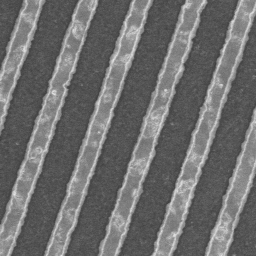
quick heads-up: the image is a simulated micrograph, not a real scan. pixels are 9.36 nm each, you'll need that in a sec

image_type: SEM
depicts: parallel lines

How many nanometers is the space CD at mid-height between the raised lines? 308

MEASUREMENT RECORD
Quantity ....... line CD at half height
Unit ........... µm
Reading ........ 0.162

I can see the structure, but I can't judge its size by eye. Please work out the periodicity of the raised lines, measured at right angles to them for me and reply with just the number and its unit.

50.8 pixels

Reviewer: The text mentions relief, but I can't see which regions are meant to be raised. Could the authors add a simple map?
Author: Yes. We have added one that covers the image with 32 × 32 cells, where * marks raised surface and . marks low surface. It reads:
...**.....**....***....***....**
...**....***....**.....**....***
..***....**.....**.....**....**.
..**.....**....***....**.....**.
..**....***....**.....**.....**.
.***....**.....**....***....**..
.**.....**....***....***....**..
.**....***....**.....**....***..
**.....**.....**....***....**...
**.....**....***....**.....**...
**....**.....**.....**....***...
*.....**.....**....***....**....
*.....**....***....**.....**....
*....***....**.....**....***....
*....**.....**....***....**.....
.....**....***....**.....**....*
....***....**.....**....***....*
....**.....**....***....**.....*
....**....***....**.....**....**
...**.....**.....**....***....**
...**.....**....***....**.....**
..***....***....**.....**....***
..**.....**.....**....***....**.
..**.....**....***....**.....**.
.***....***....**.....**....***.
.**.....**.....**....***....**..
.**....***....**.....**.....**..
.**....***....**.....**....***..
**.....**.....**....***....**...
**.....**....**.....**.....**...
**....**.....**.....**....***...
*.....**.....**....***....**....